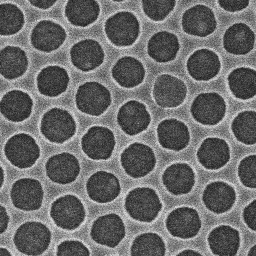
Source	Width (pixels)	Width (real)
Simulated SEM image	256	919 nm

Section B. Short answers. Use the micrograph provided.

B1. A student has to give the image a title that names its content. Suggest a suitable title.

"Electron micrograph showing a regular array of holes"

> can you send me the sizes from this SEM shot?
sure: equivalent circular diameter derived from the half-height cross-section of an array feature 120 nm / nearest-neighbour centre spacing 155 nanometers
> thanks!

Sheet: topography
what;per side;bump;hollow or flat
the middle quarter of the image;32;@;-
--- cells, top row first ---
@@-------@@@--------@@@@@@@@@@@-
@@@@---@@@@@--------@@@@@@@@@@@-
-@@@@@@@@@@@--------@@@@@@@@@@@-
-@@@@@@@@@@@--------@@@@@@@@@@@@
-@@@@@--@@@@@------@@@@@@@@@@@@@
-@@@------@@@@----@@@@@@@@@@@@@@
-@@--------@@@@@@@@@@@@@@@@@@@@@
@@@---------@@@@@@@@@@@@@@@@@@@@
@@@---------@@@@@@@@@@@@@@@@@@@@
@@@---------@@@@---@@@@@@@@@@@@@
@@@--------@@@------@@@@@@@@@@@@
-@@@-------@@@-------@@@@@@@@@@@
--@@@@---@@@@--------@@@@@@@@@@@
--@@@@@@@@@@@---------@@@@@@@@@@
---@@@@@@@@@@---------@@------@@
---@@@@@@@@@@@-------@@--------@
---@@@------@@@-----@@@--------@
---@@-------@@@@---@@@@--------@
--@@---------@@@@@@@@@@@-------@
@@@@---------@@@@@@@@@@@-------@
@@@@---------@@@-----@@@-------@
@@@@@-------@@@-------@@@@@--@@@
--@@@-------@@---------@@@@@@@@@
---@@@-----@@@---------@@@@@@@@@
----@@@@@@@@@@---------@@@@@@@@@
----@@@@@@@@@@---------@@@-----@
----@@@@@@@@@@@-------@@@-------
----@@@-----@@@@-----@@@@-------
---@@@-------@@@@--@@@@@--------
--@@@@--------@@@@@@@@@@@-------
@@@@@---------@@@@@@@@@@@-------
@@@@@@--------@@@------@@@------